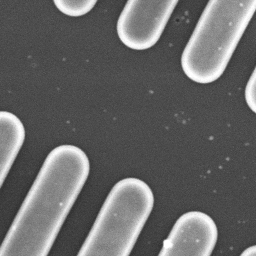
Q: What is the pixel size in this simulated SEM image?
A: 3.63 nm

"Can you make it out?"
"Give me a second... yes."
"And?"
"groups of lines, slits or small figures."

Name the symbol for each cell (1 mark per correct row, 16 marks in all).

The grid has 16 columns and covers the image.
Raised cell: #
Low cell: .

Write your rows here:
....##..###..###
.......###..###.
........##..###.
............##..
............##..
................
................
#...............
#...............
#..##...........
#..##...........
..###..##.......
..###..##.......
.###..###...#...
.###..###..##...
###..###..###...